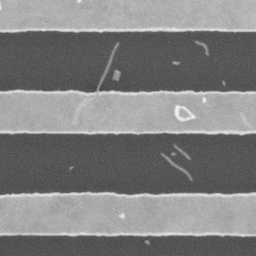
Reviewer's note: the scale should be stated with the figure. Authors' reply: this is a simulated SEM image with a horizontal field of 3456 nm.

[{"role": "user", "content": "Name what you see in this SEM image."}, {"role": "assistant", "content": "lines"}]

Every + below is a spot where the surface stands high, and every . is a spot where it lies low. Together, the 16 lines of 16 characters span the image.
++++++++++++++++
++++++++++++++++
................
................
................
................
++++++++++++++++
++++++++++++++++
................
................
................
................
++++++++++++++++
++++++++++++++++
++++++++++++++++
................